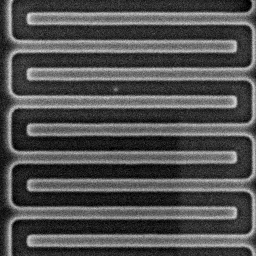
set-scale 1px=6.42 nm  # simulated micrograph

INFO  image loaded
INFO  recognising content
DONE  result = groups of lines, slits or small figures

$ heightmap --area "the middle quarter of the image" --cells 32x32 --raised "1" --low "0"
00000000000000000000000000000000
11111111111111111111111111111111
11111111111111111111111111111111
11111111111111111111111111111111
00000000000000000000000000000000
00000000000000000000000000000000
00000000000000000000000000000000
00000000000000000000000000000000
11111111111111111111111111111111
11111111111111111111111111111111
11111111111111111111111111111111
00000000000000000000000000000000
00000000000000000000000000000000
00000000000000000000000000000000
00000000000000000000000000000000
11111111111111111111111111111111
11111111111111111111111111111111
11111111111111111111111111111111
00000000000000000000000000000000
00000000000000000000000000000000
00000000000000000000000000000000
00000000000000000000000000000000
11111111111111111111111111111111
11111111111111111111111111111111
11111111111111111111111111111111
00000000000000000000000000000000
00000000000000000000000000000000
00000000000000000000000000000000
00000000000000000000000000000000
11111111111111111111111111111111
11111111111111111111111111111111
11111111111111111111111111111111